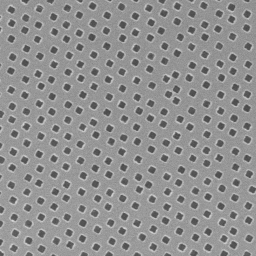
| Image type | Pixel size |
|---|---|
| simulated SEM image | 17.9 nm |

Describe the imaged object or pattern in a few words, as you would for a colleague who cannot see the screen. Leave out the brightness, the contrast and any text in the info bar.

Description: a regular array of holes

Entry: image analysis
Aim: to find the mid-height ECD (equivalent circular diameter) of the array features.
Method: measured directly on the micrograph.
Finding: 140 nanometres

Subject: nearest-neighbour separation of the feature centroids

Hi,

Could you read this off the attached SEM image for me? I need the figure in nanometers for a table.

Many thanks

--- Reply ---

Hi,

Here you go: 251